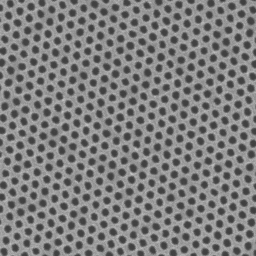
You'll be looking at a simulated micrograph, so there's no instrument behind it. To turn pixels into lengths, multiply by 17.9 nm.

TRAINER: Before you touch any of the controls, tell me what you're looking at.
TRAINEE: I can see a regular array of holes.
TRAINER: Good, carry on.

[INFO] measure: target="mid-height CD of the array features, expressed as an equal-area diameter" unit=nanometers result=146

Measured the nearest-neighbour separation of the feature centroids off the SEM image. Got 0.209 um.